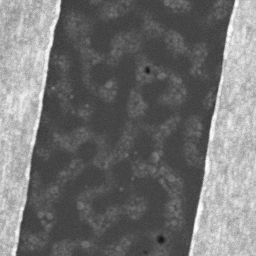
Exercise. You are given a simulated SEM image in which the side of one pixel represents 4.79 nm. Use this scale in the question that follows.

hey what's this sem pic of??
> one or a few lines or trenches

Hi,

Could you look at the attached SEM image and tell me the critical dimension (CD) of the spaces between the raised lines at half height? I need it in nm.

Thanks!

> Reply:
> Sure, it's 821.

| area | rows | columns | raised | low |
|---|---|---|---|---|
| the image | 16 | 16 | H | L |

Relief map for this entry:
HHHHLLLLLLLLLLLH
HHHLLLLLLLLLLLHH
HHHLLLLLLLLLLLHH
HHHLLLLLLLLLLLHH
HHHLLLLLLLLLLLHH
HHHLLLLLLLLLLLHH
HHHLLLLLLLLLLHHH
HHLLLLLLLLLLLHHH
HHLLLLLLLLLLLHHH
HHLLLLLLLLLLLHHH
HHLLLLLLLLLLLHHH
HHLLLLLLLLLLLHHH
HHLLLLLLLLLLHHHH
HLLLLLLLLLLLHHHH
HLLLLLLLLLLLHHHH
HLLLLLLLLLLLHHHH